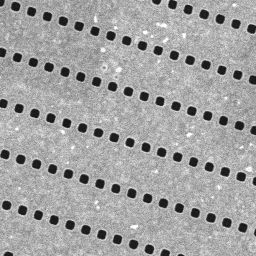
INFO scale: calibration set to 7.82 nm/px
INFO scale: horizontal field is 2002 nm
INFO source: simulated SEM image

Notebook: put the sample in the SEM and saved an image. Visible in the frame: a regular array of holes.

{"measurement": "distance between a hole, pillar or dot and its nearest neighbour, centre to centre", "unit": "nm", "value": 129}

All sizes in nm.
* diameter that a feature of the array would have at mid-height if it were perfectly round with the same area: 75.4